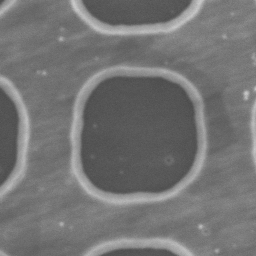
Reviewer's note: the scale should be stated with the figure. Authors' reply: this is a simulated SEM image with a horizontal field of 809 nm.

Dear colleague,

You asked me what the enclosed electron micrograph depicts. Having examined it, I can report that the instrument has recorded holes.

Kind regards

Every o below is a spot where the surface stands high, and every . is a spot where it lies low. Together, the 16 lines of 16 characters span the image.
ooooo.......oooo
oooooo.....ooooo
oooooooooooooooo
oooooooooooooooo
oooooooooooooooo
oooooo......oooo
.oooo.......oooo
.oooo.......oooo
.oooo........ooo
.oooo........ooo
.oooo.......oooo
ooooo......ooooo
oooooooooooooooo
oooooooooooooooo
oooooooooooooooo
ooooooo....ooooo